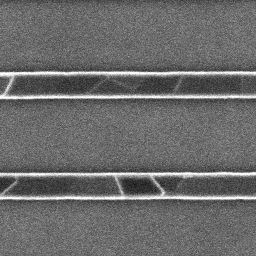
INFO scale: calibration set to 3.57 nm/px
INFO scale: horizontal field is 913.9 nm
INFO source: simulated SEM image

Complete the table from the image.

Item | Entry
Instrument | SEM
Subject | wiring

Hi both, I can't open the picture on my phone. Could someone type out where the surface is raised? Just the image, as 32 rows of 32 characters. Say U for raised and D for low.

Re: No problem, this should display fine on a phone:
DDDDDDDDDDDDDDDDDDDDDDDDDDDDDDDD
DDDDDDDDDDDDDDDDDDDDDDDDDDDDDDDD
DDDDDDDDDDDDDDDDDDDDDDDDDDDDDDDD
DDDDDDDDDDDDDDDDDDDDDDDDDDDDDDDD
DDDDDDDDDDDDDDDDDDDDDDDDDDDDDDDD
DDDDDDDDDDDDDDDDDDDDDDDDDDDDDDDD
DDDDDDDDDDDDDDDDDDDDDDDDDDDDDDDD
DDDDDDDDDDDDDDDDDDDDDDDDDDDDDDDD
DDDDDDDDDDDDDDDDDDDDDDDDDDDDDDDD
UUUUUUUUUUUUUUUUUUUUUUUUUUUUUUUU
UUUUUUUUUUUUUUUUUUUUUUUUUUUUUUUU
UUUUUUUUUUUUUUUUUUUUUUUUUUUUUUUU
DDDDDDDDDDDDDDDDDDDDDDDDDDDDDDDD
DDDDDDDDDDDDDDDDDDDDDDDDDDDDDDDD
DDDDDDDDDDDDDDDDDDDDDDDDDDDDDDDD
DDDDDDDDDDDDDDDDDDDDDDDDDDDDDDDD
DDDDDDDDDDDDDDDDDDDDDDDDDDDDDDDD
DDDDDDDDDDDDDDDDDDDDDDDDDDDDDDDD
DDDDDDDDDDDDDDDDDDDDDDDDDDDDDDDD
DDDDDDDDDDDDDDDDDDDDDDDDDDDDDDDD
DDDDDDDDDDDDDDDDDDDDDDDDDDDDDDDD
DDDDDDDDDDDDDDDDDDDDDDDDDDDDDDDD
UUUUUUUUUUUUUUUUUUUUUUUUUUUUUUUU
UUUUUUUUUUUUUUUUUUUUUUUUUUUUUUUU
UUUUUUUUUUUUUUUUUUUUUUUUUUUUUUUU
DDDDDDDDDDDDDDDDDDDDDDDDDDDDDDDD
DDDDDDDDDDDDDDDDDDDDDDDDDDDDDDDD
DDDDDDDDDDDDDDDDDDDDDDDDDDDDDDDD
DDDDDDDDDDDDDDDDDDDDDDDDDDDDDDDD
DDDDDDDDDDDDDDDDDDDDDDDDDDDDDDDD
DDDDDDDDDDDDDDDDDDDDDDDDDDDDDDDD
DDDDDDDDDDDDDDDDDDDDDDDDDDDDDDDD